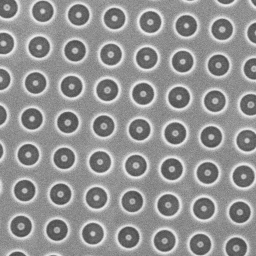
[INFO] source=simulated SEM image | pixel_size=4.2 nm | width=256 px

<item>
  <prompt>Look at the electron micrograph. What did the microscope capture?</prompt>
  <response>an array of small figures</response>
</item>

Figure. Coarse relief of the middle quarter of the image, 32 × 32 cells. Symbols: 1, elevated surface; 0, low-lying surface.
11111111111011111110000111100000
11111111111111111111011111110001
11111111111111111111111111111111
00001111111111111111111111111111
00000111100001111111111111111111
00000111000000111100001111110111
00000111001100111000000111100001
00001111000000111001000111000001
10111111100001111000001111001000
11111111111111111100001111000001
11111111111111111111111111100001
11111111111111111111111111111111
00011111111111111111111111111111
00001111000011111111111111111111
10001110000011111000011111100111
00001110011001110000001111000011
00011110000001110010001110000001
11111111000011110000001110010001
11111111111111111000011110000011
11111111111111111111111111000011
11111111111111111111111111111111
00111111111111111111111111111111
00011110000111111111111111111111
10011100000011110000111111101111
00011100000011100000011110000111
00111100000011100100011100000011
11111110000111100000011100000011
11111111111111110000111100000011
11111111111111111111111110000111
11111111111111111111111111111111
01111111111111111111111111111111
00111100001111111111111111111111